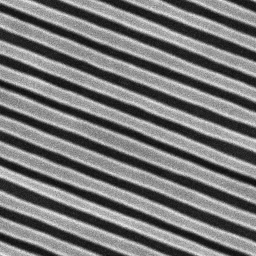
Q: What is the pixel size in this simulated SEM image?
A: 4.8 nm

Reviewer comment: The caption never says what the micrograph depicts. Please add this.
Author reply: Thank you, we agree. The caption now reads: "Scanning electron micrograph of parallel lines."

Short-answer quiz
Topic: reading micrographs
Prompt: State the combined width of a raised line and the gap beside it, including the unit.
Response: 0.114 micrometres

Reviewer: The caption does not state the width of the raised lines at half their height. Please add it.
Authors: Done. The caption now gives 62.5 nanometers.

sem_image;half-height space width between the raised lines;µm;0.0481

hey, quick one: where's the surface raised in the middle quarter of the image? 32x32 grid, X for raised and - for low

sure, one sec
X-------XXXXXXXXX--------XXXXXXX
XXX-------XXXXXXXXXX--------XXXX
XXXXXX-------XXXXXXXXX--------XX
XXXXXXXX--------XXXXXXXXX-------
--XXXXXXXX--------XXXXXXXXXX----
----XXXXXXXXX--------XXXXXXXXXX-
-------XXXXXXXXX--------XXXXXXXX
XXX-------XXXXXXXX--------XXXXXX
XXXXXX-------XXXXXXXX--------XXX
XXXXXXX--------XXXXXXXX---------
--XXXXXXXXX-------XXXXXXXX------
----XXXXXXXXX-------XXXXXXXX----
-------XXXXXXXXX-------XXXXXXXX-
XXX-------XXXXXXXX-------XXXXXXX
XXXXXX-------XXXXXXXX-------XXXX
XXXXXXXX-------XXXXXXXX-------XX
-XXXXXXXXXX-------XXXXXXXX------
---XXXXXXXXXX-------XXXXXXXXX---
------XXXXXXXXXXX-----XXXXXXXXX-
X-------XXXXXXXXXXX------XXXXXXX
XXX--------XXXXXXXXXX------XXXXX
XXXXXX--------XXXXXXXXXX------XX
XXXXXXXX--------XXXXXXXXXX------
-XXXXXXXXXX--------XXXXXXXXXX---
----XXXXXXXXXX-------XXXXXXXXXX-
-------XXXXXXXXX--------XXXXXXXX
XX-------XXXXXXXXXX-------XXXXXX
XXXXX------XXXXXXXXXXX-------XXX
XXXXXXX-------XXXXXXXXXX--------
XXXXXXXXXX-------XXXXXXXXXX-----
---XXXXXXXXX-------XXXXXXXXXX---
------XXXXXXXXX--------XXXXXXXXX